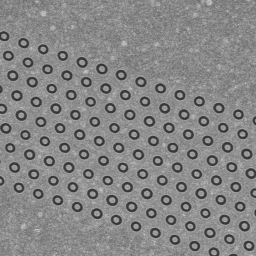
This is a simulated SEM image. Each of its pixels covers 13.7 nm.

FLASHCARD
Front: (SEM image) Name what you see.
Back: a regular array of ring-shaped grooves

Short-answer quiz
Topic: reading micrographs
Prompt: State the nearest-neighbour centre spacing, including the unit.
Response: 0.273 microns